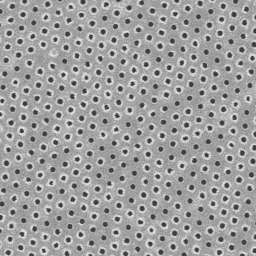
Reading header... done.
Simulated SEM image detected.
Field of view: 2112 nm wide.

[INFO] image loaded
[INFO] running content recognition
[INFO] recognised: a regular array of holes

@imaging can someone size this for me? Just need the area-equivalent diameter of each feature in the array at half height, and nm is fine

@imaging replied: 44.6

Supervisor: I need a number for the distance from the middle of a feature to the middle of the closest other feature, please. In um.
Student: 0.109